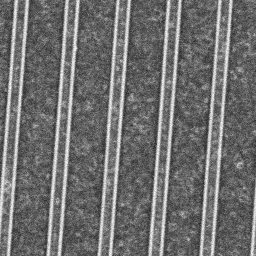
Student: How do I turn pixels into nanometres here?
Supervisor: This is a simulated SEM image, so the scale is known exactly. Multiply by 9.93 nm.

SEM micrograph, parallel lines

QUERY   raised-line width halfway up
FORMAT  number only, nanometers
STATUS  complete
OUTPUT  115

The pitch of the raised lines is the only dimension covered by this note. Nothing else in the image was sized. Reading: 504 nm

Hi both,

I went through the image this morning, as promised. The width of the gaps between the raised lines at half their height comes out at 39.8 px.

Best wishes